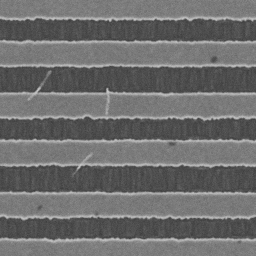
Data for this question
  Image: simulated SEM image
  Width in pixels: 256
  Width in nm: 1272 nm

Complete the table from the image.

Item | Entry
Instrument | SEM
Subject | lines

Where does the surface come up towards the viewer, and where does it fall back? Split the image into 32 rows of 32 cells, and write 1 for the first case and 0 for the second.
11111111111111111111111111111111
11111111111111111111111111111111
00100000000001100000000000000100
00000000000000000000000000000000
00000000000000000000000000000000
11111111111111111111111111111111
11111111111111111111111111111111
11111111111111111111111111111111
00000000000000000000000000000000
00000000000000000000000000000000
00000000000000000000000000000000
00001000000001000000000000000000
11111111111111111111111111111111
11111111111111111111111111111111
11111111111111111111111111111111
00000000000000000000000000000000
00000000000000000000000000000000
00001000000000011001000010011000
11111111111111111111111111111111
11111111111111111111111111111111
11111111111111111111111111111111
00000000000000000000000000000000
00000000000000000000000000000000
00000000000000000000000000000000
11111111111111111111111111111111
11111111111111111111111111111111
11111111111111111111111111111111
00000000000000000000000000000000
00000000000000000000000000000000
00000000000000000000000000000000
11111111111111111111111111111111
11111111111111111111111111111111